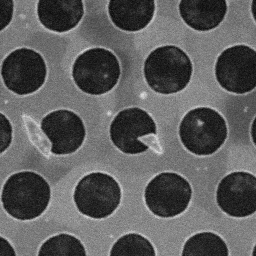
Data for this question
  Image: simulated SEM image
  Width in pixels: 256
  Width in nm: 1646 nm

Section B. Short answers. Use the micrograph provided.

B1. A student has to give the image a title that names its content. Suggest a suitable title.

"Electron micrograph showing a regular array of holes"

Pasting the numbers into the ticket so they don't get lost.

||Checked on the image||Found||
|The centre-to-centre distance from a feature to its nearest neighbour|453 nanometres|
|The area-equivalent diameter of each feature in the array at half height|304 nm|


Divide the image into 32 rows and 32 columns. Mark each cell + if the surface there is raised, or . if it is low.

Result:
..+++.....++++.....+++......+++.
..+++.....++++.....+++......+++.
.++++.....++++.....++++.....++++
.+++++...++++++...++++++...+++++
++++++++++++++++++++++++++++++++
++++++++++++++++++++++++++++++++
+....+++++....+++++....+++++....
......+++......+++......+++.....
......+++......+++......+++.....
......+++......+++......+++.....
+....++++......+++.....++++.....
++..++++++...++++++...+++++++..+
++++++++++++++++++++++++++++++++
++++++++++++++++.+++++++..++++++
.+++++....++++.....++++.....++++
.++++.....++++.....+++......+++.
..+++......+++.....+++......+++.
.+++++.....+++....+++++.....+++.
.+++++....+++++...+++++....+++++
+++++++++++++++++++++++++.++++++
++++++++++++++++++++++++++++++++
++..++++++++.++++++++++++++++..+
+.....++++....+++++....+++++....
......+++......+++......+++.....
......+++......+++......+++.....
......+++......+++......+++.....
+....+++++....+++++....+++++....
++.+++++++++++++++++++++++++++++
++++++++++++++++++++++++++++++++
+++++++..++++++...++++++...+++++
.++++.....++++.....++++.....++++
..+++......+++.....++++......+++